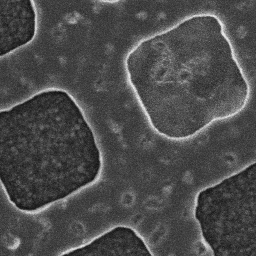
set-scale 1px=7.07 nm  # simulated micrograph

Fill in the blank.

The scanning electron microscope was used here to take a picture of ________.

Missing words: holes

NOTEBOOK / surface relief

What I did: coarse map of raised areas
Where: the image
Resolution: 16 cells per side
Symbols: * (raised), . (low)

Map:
..**************
..**************
..**************
****************
****************
****************
*....***********
.....***********
......**********
......**********
......*********.
......********..
*...********....
************....
*******.*****...
*****....****...